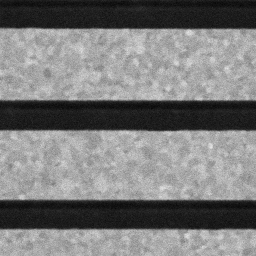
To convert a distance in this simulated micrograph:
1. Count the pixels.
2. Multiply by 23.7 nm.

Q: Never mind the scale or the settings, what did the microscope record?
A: lines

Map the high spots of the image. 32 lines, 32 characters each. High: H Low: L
LLLLLLLLLLLLLLLLLLLLLLLLLLLLLLLL
LLLLLLLLLLLLLLLLLLLLLLLLLLLLLLLL
LLLLLLLLLLLLLLLLLLLLLLLLLLLLLLLL
LLLLLLLLLLLLLLLLLLLLLLLLLLLLLLLL
HHHHHHHHHHHHHHHHHHHHHHHHHHHHHHHH
HHHHHHHHHHHHHHHHHHHHHHHHHHHHHHHH
HHHHHHHHHHHHHHHHHHHHHHHHHHHHHHHH
HHHHHHHHHHHHHHHHHHHHHHHHHHHHHHHH
HHHHHHHHHHHHHHHHHHHHHHHHHHHHHHHH
HHHHHHHHHHHHHHHHHHHHHHHHHHHHHHHH
HHHHHHHHHHHHHHHHHHHHHHHHHHHHHHHH
HHHHHHHHHHHHHHHHHHHHHHHHHHHHHHHH
LLLLLLLLLLLLLLLLLLLLLLLLLLLLLLLL
LLLLLLLLLLLLLLLLLLLLLLLLLLLLLLLL
LLLLLLLLLLLLLLLLLLLLLLLLLLLLLLLL
LLLLLLLLLLLLLLLLLLLLLLLLLLLLLLLL
HHHHHHHHHHHHHHHHHHHHHHHHHHHHHHHH
HHHHHHHHHHHHHHHHHHHHHHHHHHHHHHHH
HHHHHHHHHHHHHHHHHHHHHHHHHHHHHHHH
HHHHHHHHHHHHHHHHHHHHHHHHHHHHHHHH
HHHHHHHHHHHHHHHHHHHHHHHHHHHHHHHH
HHHHHHHHHHHHHHHHHHHHHHHHHHHHHHHH
HHHHHHHHHHHHHHHHHHHHHHHHHHHHHHHH
HHHHHHHHHHHHHHHHHHHHHHHHHHHHHHHH
HHHHHHHHHHHHHHHHHHHHHHHHHHHHHHHH
LLLLLLLLLLLLLLLLLLLLLLLLLLLLLLLL
LLLLLLLLLLLLLLLLLLLLLLLLLLLLLLLL
LLLLLLLLLLLLLLLLLLLLLLLLLLLLLLLL
LLLLLLLLLLLLLLLLLLLLLLLLLLLLLLLL
HHHHHHHHHHHHHHHHHHHHHHHHHHHHHHHH
HHHHHHHHHHHHHHHHHHHHHHHHHHHHHHHH
HHHHHHHHHHHHHHHHHHHHHHHHHHHHHHHH